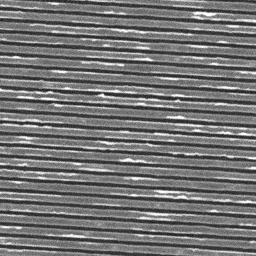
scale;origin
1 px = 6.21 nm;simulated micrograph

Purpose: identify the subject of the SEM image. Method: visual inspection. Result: parallel lines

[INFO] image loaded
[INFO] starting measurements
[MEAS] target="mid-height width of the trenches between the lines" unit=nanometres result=24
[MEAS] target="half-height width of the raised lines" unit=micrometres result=0.0418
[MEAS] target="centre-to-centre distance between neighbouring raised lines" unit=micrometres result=0.07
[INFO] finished